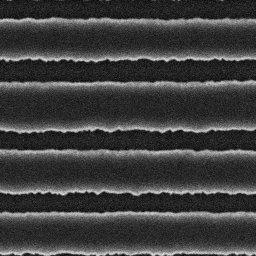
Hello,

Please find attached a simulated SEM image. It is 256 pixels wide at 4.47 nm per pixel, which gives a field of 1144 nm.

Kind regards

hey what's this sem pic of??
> lines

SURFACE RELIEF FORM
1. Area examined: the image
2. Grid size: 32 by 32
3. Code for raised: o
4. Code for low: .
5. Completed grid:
................................
................................
oo.o.ooo...ooo..o.......oo..o..o
oooooooooooooooooooooooooooooooo
oooooooooooooooooooooooooooooooo
oooooooooooooooooooooooooooooooo
oooooooooooooooooooooooooooooooo
.o...ooo.oooo.o....oo.o.....oo..
................................
................................
oooooooooooooooooooooooooooooooo
oooooooooooooooooooooooooooooooo
oooooooooooooooooooooooooooooooo
oooooooooooooooooooooooooooooooo
oooooooooooooooooooooooooooooooo
oooooooooooooooooooooooooooooooo
..ooo...............o...oo......
................................
................................
oooooooooooooooooooooooooooooooo
oooooooooooooooooooooooooooooooo
oooooooooooooooooooooooooooooooo
oooooooooooooooooooooooooooooooo
oooooooooooooooooooooooooooooooo
................................
................................
................................
oooooooooooooooooooooooooooooooo
oooooooooooooooooooooooooooooooo
oooooooooooooooooooooooooooooooo
oooooooooooooooooooooooooooooooo
oooooooooooooooooooooooooooooooo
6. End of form